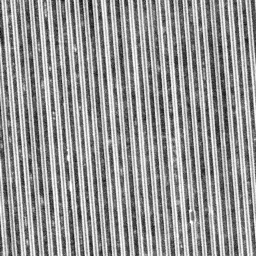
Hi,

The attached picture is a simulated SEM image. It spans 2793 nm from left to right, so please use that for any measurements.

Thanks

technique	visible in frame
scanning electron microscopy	parallel lines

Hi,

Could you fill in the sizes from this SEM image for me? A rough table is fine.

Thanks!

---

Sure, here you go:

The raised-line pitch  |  98.4 nm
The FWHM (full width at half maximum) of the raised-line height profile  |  36.7 nm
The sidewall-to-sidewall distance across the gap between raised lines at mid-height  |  55.7 nanometers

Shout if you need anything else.